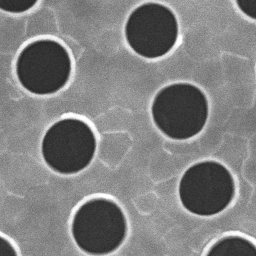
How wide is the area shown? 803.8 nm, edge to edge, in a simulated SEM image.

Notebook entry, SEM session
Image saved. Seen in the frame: holes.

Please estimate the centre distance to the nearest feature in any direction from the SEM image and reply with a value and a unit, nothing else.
83.2 px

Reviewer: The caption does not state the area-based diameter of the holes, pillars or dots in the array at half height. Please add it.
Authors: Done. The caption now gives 172 nanometers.